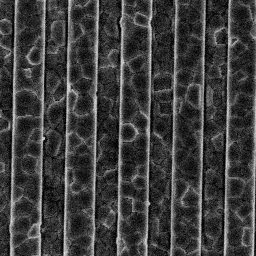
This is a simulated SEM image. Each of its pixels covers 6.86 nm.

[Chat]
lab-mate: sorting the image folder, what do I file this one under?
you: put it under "parallel lines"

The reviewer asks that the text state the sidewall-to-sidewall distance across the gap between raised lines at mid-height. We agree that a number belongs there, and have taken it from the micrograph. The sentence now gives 162 nm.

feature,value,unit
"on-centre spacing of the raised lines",366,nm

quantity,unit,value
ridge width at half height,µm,0.203